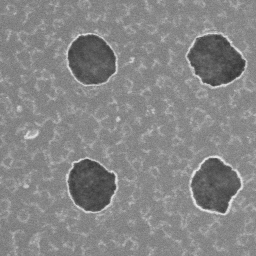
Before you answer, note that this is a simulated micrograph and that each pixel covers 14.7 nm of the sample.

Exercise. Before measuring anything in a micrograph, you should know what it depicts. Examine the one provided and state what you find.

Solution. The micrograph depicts holes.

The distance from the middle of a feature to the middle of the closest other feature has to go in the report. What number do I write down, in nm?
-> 1820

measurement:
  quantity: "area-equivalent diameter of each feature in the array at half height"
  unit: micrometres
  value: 0.746